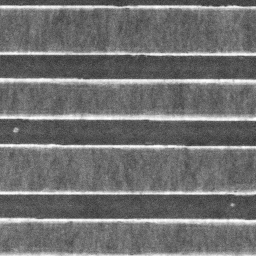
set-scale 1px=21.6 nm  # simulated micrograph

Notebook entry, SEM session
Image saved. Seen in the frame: lines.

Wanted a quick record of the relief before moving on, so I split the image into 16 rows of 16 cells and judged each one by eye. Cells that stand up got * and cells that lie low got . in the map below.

****************
****************
****************
................
................
****************
****************
................
................
****************
****************
****************
................
................
****************
****************